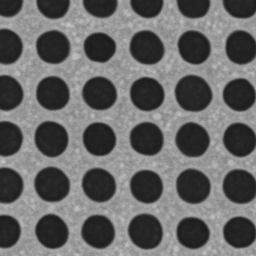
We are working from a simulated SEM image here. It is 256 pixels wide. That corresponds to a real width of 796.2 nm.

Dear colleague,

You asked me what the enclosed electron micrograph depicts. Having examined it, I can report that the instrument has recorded a regular array of holes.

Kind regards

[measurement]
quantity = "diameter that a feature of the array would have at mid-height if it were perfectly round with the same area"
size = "103 nm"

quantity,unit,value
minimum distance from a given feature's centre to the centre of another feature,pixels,45.9